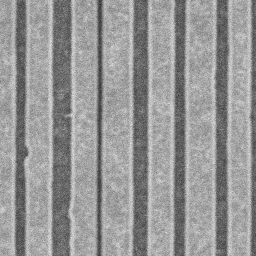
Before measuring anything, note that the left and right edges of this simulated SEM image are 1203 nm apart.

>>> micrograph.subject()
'parallel lines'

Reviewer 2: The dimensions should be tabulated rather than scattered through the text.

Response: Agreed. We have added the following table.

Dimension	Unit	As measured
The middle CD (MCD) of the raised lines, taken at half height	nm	110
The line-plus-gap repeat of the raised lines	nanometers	188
